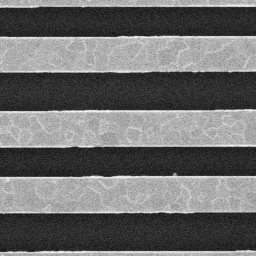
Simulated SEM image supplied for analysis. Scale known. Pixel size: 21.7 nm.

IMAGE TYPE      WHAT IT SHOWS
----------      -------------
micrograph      lines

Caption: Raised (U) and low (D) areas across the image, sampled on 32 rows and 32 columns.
UUUUUUUUUUUUUUUUUUUUUUUUUUUUUUUU
DDDDDDDDDDDDDDDDDDDDDDDDDDDDDDDD
DDDDDDDDDDDDDDDDDDDDDDDDDDDDDDDD
DDDDDDDDDDDDDDDDDDDDDDDDDDDDDDDD
DDDDDDDDDDDDDDDDDDDDDDDDDDDDDDDD
UUUUUUUUUUUUUUUUUUUUUUUUUUUUUUUU
UUUUUUUUUUUUUUUUUUUUUUUUUUUUUUUU
UUUUUUUUUUUUUUUUUUUUUUUUUUUUUUUU
UUUUUUUUUUUUUUUUUUUUUUUUUUUUUUUU
DDDDDDDDDDDDDDDDDDDDDDDDDDDDDDDD
DDDDDDDDDDDDDDDDDDDDDDDDDDDDDDDD
DDDDDDDDDDDDDDDDDDDDDDDDDDDDDDDD
DDDDDDDDDDDDDDDDDDDDDDDDDDDDDDDD
DDDDDDDDDDDDDDDDDDDDDDDDDDDDDDDD
UUUUUUUUUUUUUUUUUUUUUUUUUUUUUUUU
UUUUUUUUUUUUUUUUUUUUUUUUUUUUUUUU
UUUUUUUUUUUUUUUUUUUUUUUUUUUUUUUU
UUUUUUUUUUUUUUUUUUUUUUUUUUUUUUUU
DDDDDDDDDDDDDDDDDDDDDDDDDDDDDDDD
DDDDDDDDDDDDDDDDDDDDDDDDDDDDDDDD
DDDDDDDDDDDDDDDDDDDDDDDDDDDDDDDD
DDDDDDDDDDDDDDDDDDDDDDDDDDDDDDDD
UUUUUUUUUUUUUUUUUUUUUUUUUUUUUUUU
UUUUUUUUUUUUUUUUUUUUUUUUUUUUUUUU
UUUUUUUUUUUUUUUUUUUUUUUUUUUUUUUU
UUUUUUUUUUUUUUUUUUUUUUUUUUUUUUUU
UUUUUUUUUUUUUUUUUUUUDUUUDDDDDDDD
DDDDDDDDDDDDDDDDDDDDDDDDDDDDDDDD
DDDDDDDDDDDDDDDDDDDDDDDDDDDDDDDD
DDDDDDDDDDDDDDDDDDDDDDDDDDDDDDDD
DDDDDDDDDDDDDDDDDDDDDDDDDDDDDDDD
DDDDDDDDDDUUUUUUUUUUUUUUUUUUUUUU